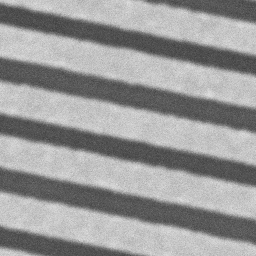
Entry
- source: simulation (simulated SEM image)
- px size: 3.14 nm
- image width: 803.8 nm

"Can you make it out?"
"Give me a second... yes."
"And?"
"lines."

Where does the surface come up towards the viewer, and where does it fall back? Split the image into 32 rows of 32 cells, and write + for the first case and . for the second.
.++++++++++++++++++.............
......++++++++++++++++++........
...........++++++++++++++++++...
++.............+++++++++++++++++
+++++++.............++++++++++++
++++++++++++.............+++++++
+++++++++++++++++.............++
..+++++++++++++++++++...........
........++++++++++++++++++......
............++++++++++++++++++++
+................+++++++++++++++
++++++................++++++++++
++++++++++++...............+++++
++++++++++++++++................
..+++++++++++++++++++...........
.......+++++++++++++++++++......
............+++++++++++++++++++.
+++..............+++++++++++++++
++++++++..............++++++++++
+++++++++++++..............+++++
++++++++++++++++++.............+
...++++++++++++++++++++.........
........+++++++++++++++++++.....
.............+++++++++++++++++++
++................++++++++++++++
+++++++................+++++++++
++++++++++++................++++
+++++++++++++++++...............
.+++++++++++++++++++++..........
......++++++++++++++++++++......
...........++++++++++++++++++++.
+++.............++++++++++++++++